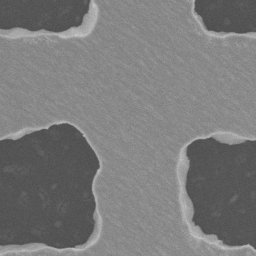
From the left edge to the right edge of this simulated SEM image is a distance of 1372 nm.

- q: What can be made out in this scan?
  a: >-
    holes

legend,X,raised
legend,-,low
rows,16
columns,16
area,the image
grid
------XXXXXX----
-----XXXXXXXX---
XXXXXXXXXXXXXXXX
XXXXXXXXXXXXXXXX
XXXXXXXXXXXXXXXX
XXXXXXXXXXXXXXXX
XXXXXXXXXXXXXXXX
XXXXXXXXXXXXXXXX
X----XXXXXXXXXXX
------XXXXXX----
------XXXXX-----
------XXXXXX----
------XXXXXX----
------XXXXXX----
------XXXXXX----
-XXX-XXXXXXXXXXX